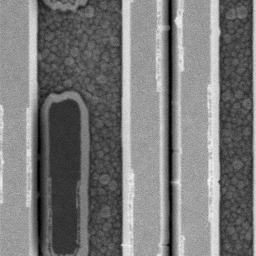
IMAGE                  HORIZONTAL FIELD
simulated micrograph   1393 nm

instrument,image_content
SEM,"one or a few lines or trenches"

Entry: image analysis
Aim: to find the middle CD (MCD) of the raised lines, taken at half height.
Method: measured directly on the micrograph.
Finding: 209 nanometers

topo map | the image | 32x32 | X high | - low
XXXX--XXXX------XXXX--XXXXX-----
XXXX------------XXXX--XXXXX-----
XXXX------------XXXX--XXXXX-----
XXXX------------XXXXX-XXXXX-----
XXXX------------XXXX--XXXXX-----
XXXX------------XXXX--XXXXX-----
XXXX------------XXXX--XXXXX-----
XXXX------------XXXX--XXXXX-----
XXXX------------XXXX--XXXXX-----
XXXX------------XXXX--XXXXX-----
XXXX------------XXXX--XXXXX-----
XXXX------------XXXX--XXXXX-----
XXXX--XXXX------XXXX--XXXXX-----
XXXX--XXXX------XXXX--XXXXX-----
XXXX--XXXXX-----XXXX--XXXXX-----
XXXX--XXXXX-----XXXX--XXXXX-----
XXXX--XXXXX-----XXXX--XXXXX-----
XXXX--XXXXX-----XXXX--XXXXX-----
XXXX--XXXXX-----XXXX--XXXXX-----
XXXX--XXXXX-----XXXX--XXXXX-----
XXXX--XXXXX-----XXXX--XXXXX-----
XXXX--XXXXX-----XXXX--XXXXX-----
XXXX--XXXX------XXXX--XXXXX-----
XXXX--XXXX------XXXX--XXXXX-----
XXXX--XXXX------XXXXX-XXXXX-----
XXXX--XXXX------XXXXX-XXXXX-----
XXXX--XXXX------XXXXX-XXXXX-----
XXXX--XXXX------XXXXX-XXXXX-----
XXXX--XXXX------XXXXX-XXXXX-----
XXXX--XXXX------XXXXX-XXXXX-----
XXXX--XXXX------XXXXX-XXXXX-----
XXXX--XXXX------XXXX--XXXXX-----